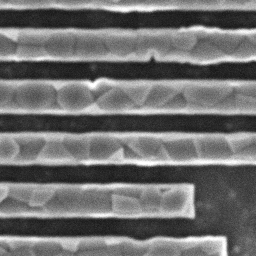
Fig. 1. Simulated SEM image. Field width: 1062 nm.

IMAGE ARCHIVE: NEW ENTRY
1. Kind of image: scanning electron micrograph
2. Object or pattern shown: parallel lines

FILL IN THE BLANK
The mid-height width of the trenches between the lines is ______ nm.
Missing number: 79.4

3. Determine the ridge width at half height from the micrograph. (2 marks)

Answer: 0.136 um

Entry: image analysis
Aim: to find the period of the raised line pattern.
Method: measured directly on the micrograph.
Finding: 215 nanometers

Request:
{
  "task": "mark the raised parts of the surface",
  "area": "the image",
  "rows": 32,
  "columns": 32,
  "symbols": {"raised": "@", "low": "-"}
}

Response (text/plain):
@@@@@@@@@@@@@@@@@@@@@@@@@@@@@@@@
---------------@----------------
--------------------------------
------------------------@@------
@@@@@@@@@@@@@@@@@@@@@@@@@@@@@@@@
@@@@@@@@@@@@@@@@@@@@@@@@@@@@@@@@
@@@@@@@@@@@@@@@@@@@@@@@@@@@@@@@@
@@@@@@@@@@@@@@@@@@@-@@@@@@@@@@@@
--------------------------------
--------------------------------
@@@@@@@@@@@@@@@@@@@@@@@@@@@@@@@@
@@@@@@@@@@@@@@@@@@@@@@@@@@@@@@@@
@@@@@@@@@@@@@@@@@@@@@@@@@@@@@@@@
@@@@@@@@@@@@@@@@@@@@@@@@@@@@@@@@
--------------------------------
--------------------------------
--------------------------------
@@@@@@@@@@@@@@@@@@@@@@@@@@@@@@@@
@@@@@@@@@@@@@@@@@@@@@@@@@@@@@@@@
@@@@@@@@@@@@@@@@@@@@@@@@@@@@@@@@
--@--@@@@@@@@-@@@@@@@@@@@@------
--------------------------------
--------------------------------
@@@@@@@@@@@@@@@@@@@@@@@@--------
@@@@@@@@@@@@@@@@@@@@@@@@--------
@@@@@@@@@@@@@@@@@@@@@@@@--------
@@@@@@@@@@@@@@@@@@@@@@@@--------
--------------------------------
--------------------------------
--------------------------------
@@@@@@@@@@@@@@@@@@@@@@@@@@@@----
@@@@@@@@@@@@@@@@@@@@@@@@@@@@----